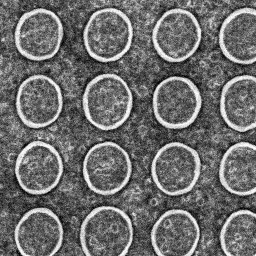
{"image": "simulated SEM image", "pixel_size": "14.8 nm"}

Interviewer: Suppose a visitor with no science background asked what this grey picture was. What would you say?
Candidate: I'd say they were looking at a regular array of raised bodies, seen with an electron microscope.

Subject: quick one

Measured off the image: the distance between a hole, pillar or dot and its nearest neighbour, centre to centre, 982 nm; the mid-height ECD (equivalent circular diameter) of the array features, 694 nm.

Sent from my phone